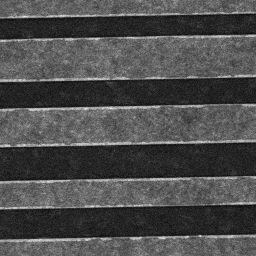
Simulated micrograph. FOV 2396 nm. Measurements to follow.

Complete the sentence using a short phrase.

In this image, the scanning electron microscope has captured one or a few lines or trenches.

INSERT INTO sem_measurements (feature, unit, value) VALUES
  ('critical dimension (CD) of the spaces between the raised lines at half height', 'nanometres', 271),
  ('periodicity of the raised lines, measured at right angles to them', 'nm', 630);